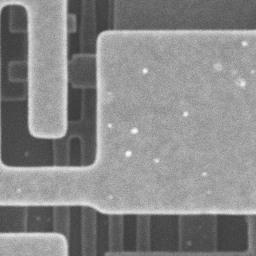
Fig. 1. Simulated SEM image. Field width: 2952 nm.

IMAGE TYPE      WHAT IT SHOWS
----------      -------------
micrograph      wiring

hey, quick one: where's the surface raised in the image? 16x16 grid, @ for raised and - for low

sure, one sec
-@@@------------
--@@------------
--@@--@@@@@@@@@@
--@@--@@@@@@@@@@
--@@--@@@@@@@@@@
--@@--@@@@@@@@@@
--@@--@@@@@@@@@@
--@@--@@@@@@@@@@
--@@--@@@@@@@@@@
------@@@@@@@@@@
@-@@@@@@@@@@@@@@
@@@@@@@@@@@@@@@@
@@@@@@@@@@@@@@@@
----------------
----------------
@@@@------------